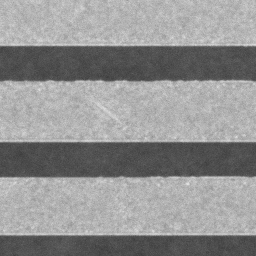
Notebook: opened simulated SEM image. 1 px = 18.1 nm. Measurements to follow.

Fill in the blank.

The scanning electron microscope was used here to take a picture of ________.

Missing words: lines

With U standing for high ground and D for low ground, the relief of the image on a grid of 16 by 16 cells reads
UUUUUUUUUUUUUUUU
UUUUUUUUUUUUUUUU
UUUUUUUUUUUUUUUU
DDDDDDDDDDDDDDDD
DDDDDDDDDDDDDDDD
UUUUUUUUUUUUUUUU
UUUUUUUUUUUUUUUU
UUUUUUUUUUUUUUUU
UUUUUUUUUUUUUUUU
DDDDDDDDDDDDDDDD
DDDDDDDDDDDDDDDD
UUUUUUUUUUUUUUUU
UUUUUUUUUUUUUUUU
UUUUUUUUUUUUUUUU
UUUUUUUUUUUUUUUU
DDDDDDDDDDDDDDDD